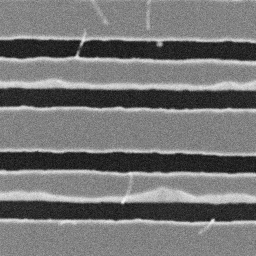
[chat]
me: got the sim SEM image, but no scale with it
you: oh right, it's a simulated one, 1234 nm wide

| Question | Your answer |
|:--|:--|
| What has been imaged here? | lines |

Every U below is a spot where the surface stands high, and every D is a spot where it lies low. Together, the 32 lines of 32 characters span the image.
UUUUUUUUUUUUUUUUUUUUUUUUUUUUUUUU
UUUUUUUUUUUUUUUUUUUUUUUUUUUUUUUU
UUUUUUUUUUUUUUUUUUUUUUUUUUUUUUUU
UUUUUUUUUUUUUUUUUUUUUUUUUUUUUUUU
UUUUUUUUUUUUUUUUUUUUUUUUUUUUUUUU
DDDDDDDDDDDDDDDDDDDDDDDDDDDDDDDD
DDDDDDDDDDDDDDDDDDDDDDDDDDDDDDDD
UUUUUUUUUUUUUUUUUUUDDDDDDUUUDDDD
UUUUUUUUUUUUUUUUUUUUUUUUUUUUUUUU
UUUUUUUUUUUUUUUUUUUUUUUUUUUUUUUU
UUUUUUUUUUUUUUUUUUUUUUUUUUUUUUUU
DDDDDDDDDDDDDDDDDDDDDDDDDDDDDDDD
DDDDDDDDDDDDDDDDDDDDDDDDDDDDDDDD
UUUUUDUUUUUDDDUDDDDDDDDDDDDDDDDD
UUUUUUUUUUUUUUUUUUUUUUUUUUUUUUUU
UUUUUUUUUUUUUUUUUUUUUUUUUUUUUUUU
UUUUUUUUUUUUUUUUUUUUUUUUUUUUUUUU
UUUUUUUUUUUUUUUUUUUUUUUUUUUUUUUU
UUUUUUUUUUUUUUUUUUUUUUUUUUUUUUUU
DDDDDDDDDDDDDDDDDDDDDDDDDDDDDDUD
DDDDDDDDDDDDDDDDDDDDDDDDDDDDDDDD
UUUUUUUUUUUUUDDDDDDDDDDDDDDDDDDD
UUUUUUUUUUUUUUUUUUUUUUUUUUUUUUUU
UUUUUUUUUUUUUUUUUUUUUUUUUUUUUUUU
UUUUUUUUUUUUUUUUUUUUUUUUUUUUUUUU
DDDDDDDDDDDDDDDDDDDDDDDDDDDDDDDD
DDDDDDDDDDDDDDDDDDDDDDDDDDDDDDDD
UUUUDDUDDDDDDDDDUUDDDDDDDDDDDDDD
UUUUUUUUUUUUUUUUUUUUUUUUUUUUUUUU
UUUUUUUUUUUUUUUUUUUUUUUUUUUUUUUU
UUUUUUUUUUUUUUUUUUUUUUUUUUUUUUUU
UUUUUUUUUUUUUUUUUUUUUUUUUUUUUUUU